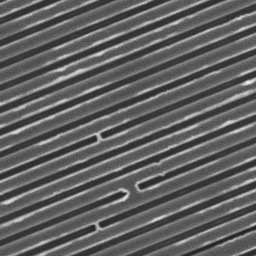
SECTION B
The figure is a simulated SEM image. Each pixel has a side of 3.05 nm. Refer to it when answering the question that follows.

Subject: parallel lines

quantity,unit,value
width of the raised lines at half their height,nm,41.8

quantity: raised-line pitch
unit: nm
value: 62.9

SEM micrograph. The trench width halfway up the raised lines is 0.0209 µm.